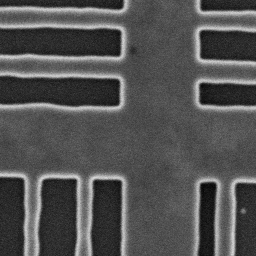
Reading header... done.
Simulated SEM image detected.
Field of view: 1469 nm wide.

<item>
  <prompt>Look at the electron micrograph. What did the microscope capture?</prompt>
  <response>groups of lines, slits or small figures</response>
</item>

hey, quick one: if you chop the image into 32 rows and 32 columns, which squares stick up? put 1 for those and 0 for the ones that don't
00000000000000001111111110000000
11111111111111111111111111000000
11111111111111111111111111111111
00000000000000111111111111111111
00000000000000011111111110000000
00000000000000011111111110000000
00000000000000011111111110000000
11111111111111111111111111000000
11111111111111111111111111111111
00111111111111111111111111111111
00000000000000011111111110000000
00000000000000011111111110000000
00000000000000011111111110000000
11111111111111111111111111111111
11111111111111111111111111111111
11111111111111111111111111111111
11111111111111111111111111111111
11111111111111111111111111111111
11111111111111111111111111111111
11111111111111111111111111111111
11111111111111111111111111111111
11111111111111111111111111111111
00011000001100011111111111111111
00011000001000011111111110011000
00011000001000011111111110011000
00011000001000011111111110011000
00011000001000011111111110011000
00011000001000011111111110011000
00011000001000011111111110011000
00011000001000011111111110011000
00011000001000011111111110011000
00011000001000011111111110011000